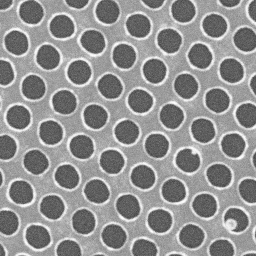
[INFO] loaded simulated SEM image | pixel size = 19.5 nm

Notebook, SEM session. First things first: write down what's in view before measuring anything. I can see a regular array of holes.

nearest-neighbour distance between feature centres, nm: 649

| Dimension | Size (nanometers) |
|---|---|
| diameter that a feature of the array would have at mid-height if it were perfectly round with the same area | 502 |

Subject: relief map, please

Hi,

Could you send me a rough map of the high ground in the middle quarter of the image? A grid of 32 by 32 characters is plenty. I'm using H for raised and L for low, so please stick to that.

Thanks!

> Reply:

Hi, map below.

HLLLLLHHHHHHHLLLLHHHLLLLLLHHHHHH
HLLLLLLHHHHHHHHLHHHLLLLLLLHHHHHH
HLLLLLLHHHLLHHHHHHHHLLLLLLHHHLLL
HLLLLLLHHLLLLLHHHHHHLLLLLHHHLLLL
HHLLLLHHLLLLLLHHHHHHHLLLLHHLLLLL
HHHHHHHHLLLLLLLHHHHHHHHHHHHLLLLL
LHHHHHHHHLLLLLLHHLLLHHHHHHHLLLLL
LLHHHHHHHLLLLLHHLLLLLLHHHHHHLLLL
LLLHHHHHHHLLLHHHLLLLLLHHHHHHHLLL
LLLHHHHHHHHHHHHHLLLLLLLHHHHHHHHH
LLLHHHLLLLHHHHHHLLLLLLHHHLLLLHHH
LLLHHLLLLLLHHHHHHLLLLLHHLLLLLLHH
LLHHHLLLLLLHHHHHHHHLHHHHLLLLLLHH
HHHHHLLLLLLHHHHHHHHHHHHHLLLLLLHH
HHHHHLLLLLLHHHLLLHHHHHHHLLLLLLHH
HHHHHHLLLLHHHLLLLLLHHHHHHLLLLHHH
HHHHHHHHHHHHLLLLLLLHHHHHHHLHHHHH
HHHHHHHHHHHHHLLLLLLHHHLLLHHHHHHH
HHLLLLLHHHHHHLLLLLLHLLLLLLHHHHHH
HLLLLLLHHHHHHHLLLLHHLLLLLLHHHHHH
HLLLLLLLHHHHHHHHHHHHLLLLLLLHHHHH
HLLLLLLLHHLLLHHHHHHHLLLLLLHHHLLL
HHLLLLLHHLLLLLLHHHHHHLLLLLHHLLLL
HHHLLLHHHLLLLLLHHHHHHHHLHHHHLLLL
HHHHHHHHHLLLLLLHHHHHHHHHHHHHLLLL
LLHHHHHHHLLLLLLHHHLLLHHHHHHHLLLL
LLLHHHHHHHLLLLHHHLLLLLHHHHHHHLLL
LLLLHHHHHHHLLHHHHLLLLLLHHHHHHHHH
LLLLHHHHHHHHHHHHHLLLLLLHHHHLHHHH
LLLLHHLLLLHHHHHHHLLLLLLHHLLLLLHH
LLLHHLLLLLLHHHHHHHLLLLHHLLLLLLHH
HLHHHLLLLLLHHHHHHHHHLHHHLLLLLLLH